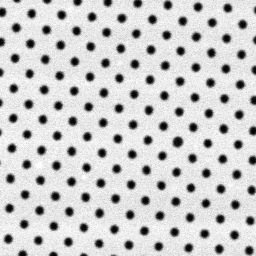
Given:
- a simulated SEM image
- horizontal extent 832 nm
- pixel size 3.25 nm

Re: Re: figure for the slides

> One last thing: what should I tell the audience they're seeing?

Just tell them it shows a regular array of holes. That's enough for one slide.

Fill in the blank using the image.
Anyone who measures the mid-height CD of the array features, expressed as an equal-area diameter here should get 27.7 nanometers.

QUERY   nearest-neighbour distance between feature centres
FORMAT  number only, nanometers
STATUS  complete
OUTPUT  67.9